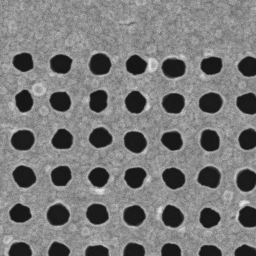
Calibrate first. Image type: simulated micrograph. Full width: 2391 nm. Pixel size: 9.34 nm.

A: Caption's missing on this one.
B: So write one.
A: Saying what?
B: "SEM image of a regular array of holes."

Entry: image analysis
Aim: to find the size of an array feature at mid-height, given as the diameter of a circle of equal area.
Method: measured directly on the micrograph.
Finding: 198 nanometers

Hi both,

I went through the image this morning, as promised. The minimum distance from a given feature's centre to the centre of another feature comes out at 340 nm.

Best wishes